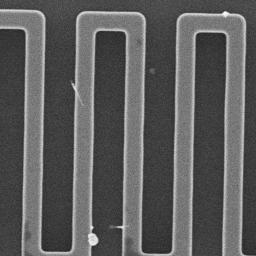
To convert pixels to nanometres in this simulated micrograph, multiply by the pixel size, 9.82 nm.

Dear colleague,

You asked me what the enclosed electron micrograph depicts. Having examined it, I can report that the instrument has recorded groups of lines, slits or small figures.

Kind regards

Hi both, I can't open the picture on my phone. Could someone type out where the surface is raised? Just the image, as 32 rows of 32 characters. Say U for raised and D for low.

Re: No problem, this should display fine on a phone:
DDDDDDDDDDDDDDDDDDDDDDDDDDDDDDDD
UUUUUDDDDDUUUUUUDDDDDDDDDDDDDDDD
UUUUUUDDDDUUUUUUUUDDDDUUUUUUUUUD
UUUUUUDDDDUUUUUUUUDDDDUUUUUUUUUD
DDDUUUDDDDUUDDDDUUDDDDUUDDDDUUUD
DDDUUUDDDDUUDDDDUUDDDDUUDDDDUUUD
DDDUUUDDDDUUDDDDUUDDDDUUDDDDUUUD
DDDUUUDDDUUUDDDDUUDDDDUUDDDDUUUD
DDDUUUDDDUUUDDDDUUDDDDUUDDDDUUUD
DDDUUDDDDUUUDDDDUUDDDDUUDDDDUUUD
DDDUUDDDDUUUDDDDUUDDDDUUDDDDUUUD
DDDUUDDDDUUUDDDDUUDDDDUUDDDDUUUD
DDDUUDDDDUUUDDDDUUDDDDUUDDDDUUUD
DDDUUDDDDUUUDDDDUUDDDDUUDDDDUUUD
DDDUUDDDDUUUDDDDUUDDDDUUDDDDUUDD
DDDUUDDDDUUUDDDDUUDDDDUUDDDDUUDD
DDDUUDDDDUUUDDDDUUDDDDUUDDDDUUDD
DDDUUDDDDUUUDDDDUUDDDDUUDDDDUUDD
DDDUUDDDDUUUDDDDUUDDDDUUDDDDUUDD
DDDUUDDDDUUUDDDDUUDDDDUUDDDDUUDD
DDDUUDDDDUUUDDDDUUDDDDUUDDDDUUDD
DDDUUDDDDUUUDDDDUUDDDDUUDDDDUUDD
DDDUUDDDDUUUDDDUUUDDDDUUDDDDUUDD
DDDUUDDDDUUDDDDUUUDDDDUUDDDDUUDD
DDDUUDDDDUUDDDDUUUDDDDUUDDDDUUDD
DDDUUDDDDUUDDDDUUUDDDDUUDDDDUUDD
DDDUUDDDDUUDDDDUUUDDDDUUDDDDUUDD
DDDUUDDDDUUDDDDUUUDDDDUUDDDDUUDD
DDDUUDDDDUUUDDDUUUDDDDUUDDDDUUDD
DDDUUDDDDUUUDDDUUUDDDDUUDDDDUUDD
DDDUUDDDDUUUDDDUUUDDDDUUDDDDUUDD
DDDUUUDDUUUDDDDUUUDDDUUUDDDDUUDD